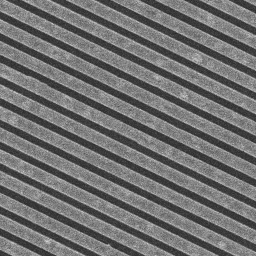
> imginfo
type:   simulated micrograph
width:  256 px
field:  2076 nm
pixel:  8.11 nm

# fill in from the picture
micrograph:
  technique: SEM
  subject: parallel lines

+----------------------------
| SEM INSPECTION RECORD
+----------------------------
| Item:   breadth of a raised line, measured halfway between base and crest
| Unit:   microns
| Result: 0.0967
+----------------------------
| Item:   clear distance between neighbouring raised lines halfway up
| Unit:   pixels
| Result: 7.64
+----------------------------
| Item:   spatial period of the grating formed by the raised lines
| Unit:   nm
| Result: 158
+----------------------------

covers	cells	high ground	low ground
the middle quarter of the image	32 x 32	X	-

-XXXXXXX----XXXXXXX-----XXXXXX--
---XXXXXXX----XXXXXXX-----XXXXXX
X----XXXXXXX----XXXXXXX-----XXXX
XXX----XXXXXXX----XXXXXXX-----XX
XXXXX----XXXXXXX-----XXXXXX-----
XXXXXXX----XXXXXXX-----XXXXXX---
--XXXXXXX----XXXXXXX-----XXXXXX-
----XXXXXXX----XXXXXXX-----XXXXX
XX----XXXXXXX-----XXXXXX-----XXX
XXXX----XXXXXXX-----XXXXXX-----X
XXXXXX----XXXXXXX-----XXXXXX----
--XXXXXX----XXXXXXX-----XXXXXX--
----XXXXXX-----XXXXXX-----XXXXXX
X-----XXXXXX-----XXXXXX-----XXXX
XXX-----XXXXXX-----XXXXXX-----XX
XXXXX-----XXXXXXX----XXXXXX-----
-XXXXXX------XXXXXX----XXXXXX---
---XXXXXX------XXXXXX----XXXXXX-
-----XXXXXXX-----XXXXXX----XXXXX
XX-----XXXXXXX----XXXXXXX----XXX
XXXX-----XXXXXXX----XXXXXXX----X
XXXXXX-----XXXXXXX----XXXXXXX---
--XXXXXXX----XXXXXXX----XXXXXXX-
----XXXXXXX----XXXXXXX----XXXXXX
X-----XXXXXXX----XXXXXXX----XXXX
XXX-----XXXXXXX----XXXXXXX----XX
XXXXXX----XXXXXXX----XXXXXXX----
-XXXXXXX----XXXXXXX----XXXXXXX--
---XXXXXXX----XXXXXXX----XXXXXXX
-----XXXXXXX----XXXXXXX----XXXXX
XXX----XXXXXXX----XXXXXXX----XXX
XXXXX----XXXXXXX----XXXXXXX-----